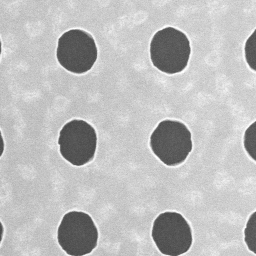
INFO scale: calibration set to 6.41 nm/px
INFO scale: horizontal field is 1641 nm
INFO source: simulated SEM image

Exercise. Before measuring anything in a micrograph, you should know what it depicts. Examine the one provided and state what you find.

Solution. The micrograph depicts holes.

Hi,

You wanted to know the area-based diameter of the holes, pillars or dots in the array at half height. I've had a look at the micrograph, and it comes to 0.275 micrometres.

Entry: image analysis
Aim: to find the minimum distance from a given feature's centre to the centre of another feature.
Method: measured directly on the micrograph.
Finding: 586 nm